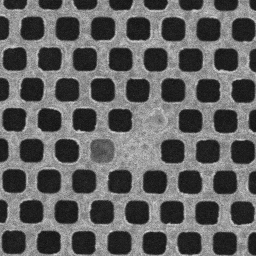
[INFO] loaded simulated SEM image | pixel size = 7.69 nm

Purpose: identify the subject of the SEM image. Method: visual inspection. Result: a regular array of holes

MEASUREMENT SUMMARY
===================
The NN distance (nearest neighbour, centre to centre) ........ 0.268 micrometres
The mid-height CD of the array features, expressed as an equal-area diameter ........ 195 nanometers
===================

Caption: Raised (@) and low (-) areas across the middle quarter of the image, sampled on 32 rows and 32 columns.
@@------@@@------@@@------@@@---
@@@----@@@@@----@@@@@----@@@@---
@@@@@@@@@@@@@@@@@@@@@@@@@@@@@@@@
@@@@@@@@---@@@@@@@@@@@@@@@@@@@@@
---@@@@-----@@@@-----@@@@-----@@
----@@@------@@------@@@------@@
----@@@------@@-------@@------@@
----@@@------@@------@@@------@@
---@@@@------@@@-----@@@@-----@@
@-@@@@@@@--@@@@@@---@@@@@@--@@@@
@@@@@@@@@@@@@@@@@@@@@@@@@@@@@@@@
@@@----@@@@@----@@@@@@@@@@@@@@--
@@------@@@------@@@@@@@@@@@@---
@@------@@@------@@@@@@@@@@@@---
@@------@@@------@@@@@@@@@@@@---
@@------@@@------@@@@@@@@@@@@---
@@@@---@@@@@----@@@@@@@@@@@@@---
@@@@@@@@@@@@@@@@@@@@@@@@@@@@@@@@
@@@@@@@@@@@@@@@@@@@@@@@@@@@@@@@@
---@@@@@@@@@@@@@@@@@@@@@@-----@@
----@@@@-@@@@@@@@@@@@@@@------@@
----@@@----@@@@@@@@@@@@@------@@
----@@@----@@@@@@@@@@@@@------@@
----@@@@-@@@@@@@@@@@@@@@------@@
---@@@@@@@@@@@@@@@@@@@@@@----@@@
@@@@@@@@@@@@@@@@@@@@@@@@@@@@@@@@
@@@---@@@@@@@---@@@@@-@@@@@@@@@@
@@------@@@------@@@-----@@@@---
@@------@@@------@@@------@@----
@@------@@@------@@@------@@----
@@------@@@------@@@------@@----
@@------@@@------@@@-----@@@@---